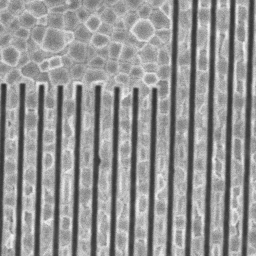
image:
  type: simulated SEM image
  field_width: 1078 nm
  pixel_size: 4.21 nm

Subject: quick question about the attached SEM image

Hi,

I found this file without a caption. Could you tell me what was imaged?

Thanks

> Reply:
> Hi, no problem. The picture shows parallel lines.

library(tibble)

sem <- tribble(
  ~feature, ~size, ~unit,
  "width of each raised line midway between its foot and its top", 55.3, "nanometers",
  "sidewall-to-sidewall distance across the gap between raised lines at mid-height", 22.1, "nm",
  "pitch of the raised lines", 79.6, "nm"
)